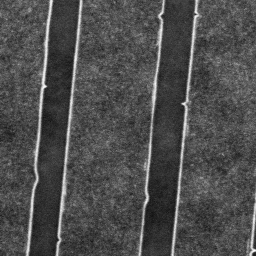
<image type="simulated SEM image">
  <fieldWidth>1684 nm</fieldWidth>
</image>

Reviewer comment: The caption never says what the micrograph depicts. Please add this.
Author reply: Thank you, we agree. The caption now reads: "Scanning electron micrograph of one or a few lines or trenches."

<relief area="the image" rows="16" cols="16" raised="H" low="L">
HHHLLHHHHHLLHHHH
HHHLLHHHHHLLHHHH
HHHLLHHHHHLLHHHH
HHHLLHHHHHLLHHHH
HHHLLHHHHHLLHHHH
HHHLLHHHHHLLHHHH
HHHLHHHHHHLLHHHH
HHHLHHHHHHLLHHHH
HHLLHHHHHLLHHHHH
HHLLHHHHHLLHHHHH
HHLLHHHHHLLHHHHH
HHLLHHHHHLLHHHHH
HHLLHHHHHLLHHHHH
HHLLHHHHHLLHHHHH
HHLLHHHHHLLHHHHH
HHLLHHHHHLLHHHHH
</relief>